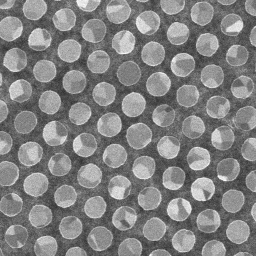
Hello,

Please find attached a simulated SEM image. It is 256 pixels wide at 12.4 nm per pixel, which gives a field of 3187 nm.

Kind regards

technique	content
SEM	a regular array of raised bodies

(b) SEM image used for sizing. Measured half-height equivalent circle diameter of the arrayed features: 285 nanometres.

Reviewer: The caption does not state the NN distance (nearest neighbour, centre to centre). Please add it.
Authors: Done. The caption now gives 390 nm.